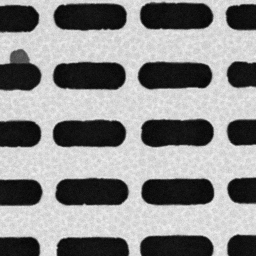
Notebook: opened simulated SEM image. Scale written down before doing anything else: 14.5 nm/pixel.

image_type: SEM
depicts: a regular array of holes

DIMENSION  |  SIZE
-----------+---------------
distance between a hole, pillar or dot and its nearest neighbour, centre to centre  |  0.841 um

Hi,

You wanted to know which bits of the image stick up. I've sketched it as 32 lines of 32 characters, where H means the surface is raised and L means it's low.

HHHHHHHHHLLLLLHHHHLLLLLLLLHHHHHH
LLLLLHHLLLLLLLLLHHLLLLLLLLLHLLLL
LLLLLHHLLLLLLLLLHHLLLLLLLLLHLLLL
LLLLHHHHLLLLLLLHHHLLLLLLLLHHHLLL
HHHHHHHHHHHHHHHHHHHHHHHHHHHHHHHH
HHHHHHHHHHHHHHHHHHHHHHHHHHHHHHHH
HHLHHHHHHHHHHHHHHHHHHHHHHHHHHHHH
HLLLHHHHHHHHHHHHHHHHHHHHHHHHHHHH
LLLLLHHLLLLLLLLHHHLLLLLLLLHHHLLL
LLLLLHHLLLLLLLLLHLLLLLLLLLHHLLLL
LLLLLHHLLLLLLLLHHHLLLLLLLLHHHLLL
HHHHHHHHHHHHHHHHHHHHHHHHHHHHHHHH
HHHHHHHHHHHHHHHHHHHHHHHHHHHHHHHH
HHHHHHHHHHHHHHHHHHHHHHHHHHHHHHHH
HHHHHHHHHHHHHHHHHHHHHHHHHHHHHHHH
LLLLLHHLLLLLLLLHHHLLLLLLLLHHHLLL
LLLLLHHLLLLLLLLLHHLLLLLLLLLHLLLL
LLLLLHHLLLLLLLLLHHLLLLLLLLHHHLLL
HHHHHHHHHHHHHHHHHHHHHHHHHHHHHHHH
HHHHHHHHHHHHHHHHHHHHHHHHHHHHHHHH
HHHHHHHHHHHHHHHHHHHHHHHHHHHHHHHH
HHHHHHHHHHHHHHHHHHHHHHHHHHHHHHHH
LLLLHHHHLLLLLLLHHHHLLLLLLLHHHLLL
LLLLLHHLLLLLLLLLHHLLLLLLLLLHLLLL
LLLLLHHLLLLLLLLLHHLLLLLLLLLHHLLL
LLLLHHHHLLLLLLLHHHHLLLLLLLHHHHLL
HHHHHHHHHHHHHHHHHHHHHHHHHHHHHHHH
HHHHHHHHHHHHHHHHHHHHHHHHHHHHHHHH
HHHHHHHHHHHHHHHHHHHHHHHHHHHHHHHH
HHHHHHHHHHHHHHHHHHHLLLLLLHHHHLLL
LLLLLHHLLLLLLLLLHHLLLLLLLLLHLLLL
LLLLLHHLLLLLLLLLHHLLLLLLLLLHLLLL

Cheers